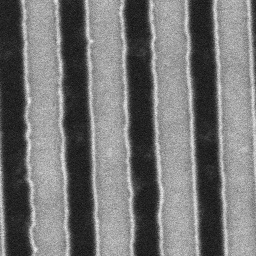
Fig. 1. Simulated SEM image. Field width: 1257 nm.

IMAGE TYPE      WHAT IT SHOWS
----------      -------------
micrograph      one or a few lines or trenches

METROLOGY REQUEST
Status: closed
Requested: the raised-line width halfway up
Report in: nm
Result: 154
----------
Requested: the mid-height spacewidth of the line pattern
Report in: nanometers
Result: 162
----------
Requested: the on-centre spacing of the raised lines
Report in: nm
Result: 316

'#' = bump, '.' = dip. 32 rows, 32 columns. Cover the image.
###....####....####....####....#
###....####....####....####....#
###....####....####....####....#
###....####....####....####....#
###....####....####....####....#
###....####....####....####....#
###....####....####....####....#
###....####....####....####....#
###.....###....####....####....#
###....####....####.....###....#
###....####.....####....###.....
###....####.....####....###.....
####....###.....####....###.....
####....###.....####....####....
###.....####....####....####....
####...#####....####....####....
####....####....####....####....
####....####....####....####....
####....####....####....####....
####....####....####....####....
####....####....####....####....
####....####....####....####....
####....####....####....####....
####....####....####....####....
####....####....####....####....
####....####....####....####....
####....####....####....####....
####....####....####....####....
####....####....####....####....
####....####....####.....###....
####....####....####.....###....
####....####....####.....###....